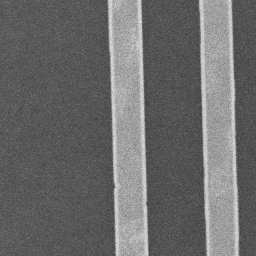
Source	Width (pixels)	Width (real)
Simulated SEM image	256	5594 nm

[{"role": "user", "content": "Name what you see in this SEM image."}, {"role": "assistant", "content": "one or a few lines or trenches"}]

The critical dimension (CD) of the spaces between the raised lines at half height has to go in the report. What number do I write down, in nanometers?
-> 1370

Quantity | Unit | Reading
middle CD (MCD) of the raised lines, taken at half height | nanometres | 620